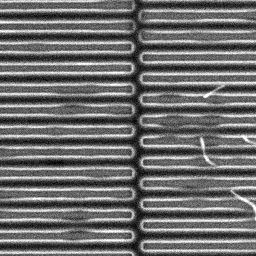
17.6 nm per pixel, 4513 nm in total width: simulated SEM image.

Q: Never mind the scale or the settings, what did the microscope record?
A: groups of lines, slits or small figures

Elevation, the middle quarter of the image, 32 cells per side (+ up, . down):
.................+++++++++++++++
.................+++++++++++++++
++++++++++++++++++++++++++++++++
+++++++++++++++++++.............
++++++++++++++++++++............
.................+++++++++++++++
.................+++++++++++++++
.........++++++++++++++++..+++++
+++++++++++++++++++.............
+++++++++++++++++++.............
.................+++++++++++++++
.................+++++++++++++++
.................+++++++++++++++
++++++++++++++++++++............
+++++++++++++++++++.............
+++++++++++++++++++++++++.....++
.................+++++++++++++++
.................+++++++++++++++
++++++++++++++++++++............
+++++++++++++++++++.............
+++++++++++++++++++++++++.+++++.
.................+++++++++++++++
.................+++++++++++++++
+++++++++++++++++++++...........
+++++++++++++++++++.............
++++++++++++++++++++............
.................+++++++++++++++
.................+++++++++++++++
+++++++....+++++++++++++++++++++
+++++++++++++++++++.............
+++++++++++++++++++.............
.................+++++++++++++++